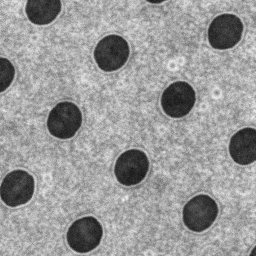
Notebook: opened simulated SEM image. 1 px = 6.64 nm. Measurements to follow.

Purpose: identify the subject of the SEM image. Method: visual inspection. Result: holes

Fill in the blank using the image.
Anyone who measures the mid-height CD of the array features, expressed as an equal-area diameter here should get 0.245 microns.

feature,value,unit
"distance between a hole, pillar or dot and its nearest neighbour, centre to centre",544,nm